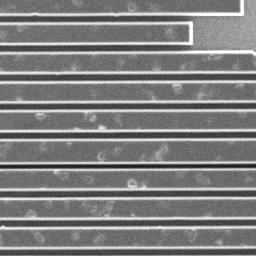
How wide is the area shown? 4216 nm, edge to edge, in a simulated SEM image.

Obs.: parallel lines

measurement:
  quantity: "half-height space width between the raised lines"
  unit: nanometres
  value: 126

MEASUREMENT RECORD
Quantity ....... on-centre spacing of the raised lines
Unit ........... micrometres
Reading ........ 0.481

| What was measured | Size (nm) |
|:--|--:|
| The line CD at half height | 362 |